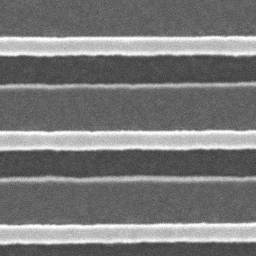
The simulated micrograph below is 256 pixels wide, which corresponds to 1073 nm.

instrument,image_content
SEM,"lines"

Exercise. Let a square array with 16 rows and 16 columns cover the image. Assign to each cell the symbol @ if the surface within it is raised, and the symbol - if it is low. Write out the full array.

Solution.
@@@@@@@@@@@@@@@@
@@@@@@@@@@@@@@@@
@@@@@@@@@@@@@@@@
----------------
----------------
@@@@@@@@@@@@@@@@
@@@@@@@@@@@@@@@@
@@@@@@@@@@@@@@@@
@@@@@@@@@@@@@@@@
----------------
----------------
@@@@@@@@@@@@@@@@
@@@@@@@@@@@@@@@@
@@@@@@@@@@@@@@@@
@@@@@@@@@@@@@@@@
----------------